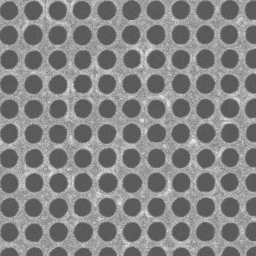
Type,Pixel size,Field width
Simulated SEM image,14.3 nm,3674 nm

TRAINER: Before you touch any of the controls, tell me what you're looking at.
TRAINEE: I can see a regular array of holes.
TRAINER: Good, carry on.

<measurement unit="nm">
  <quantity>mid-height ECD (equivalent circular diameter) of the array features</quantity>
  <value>278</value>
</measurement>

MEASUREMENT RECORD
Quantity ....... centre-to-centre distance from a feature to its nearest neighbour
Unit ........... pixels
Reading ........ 24.1